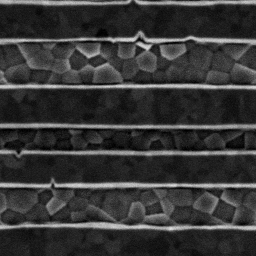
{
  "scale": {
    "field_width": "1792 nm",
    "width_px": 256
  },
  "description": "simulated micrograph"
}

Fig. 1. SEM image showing one or a few lines or trenches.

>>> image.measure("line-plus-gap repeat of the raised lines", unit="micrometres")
0.51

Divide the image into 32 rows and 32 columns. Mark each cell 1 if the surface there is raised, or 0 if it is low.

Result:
11111111111111111111111111111111
11111111111111111111111111111111
11111111111111111111111111111111
11111111111111111111111111111111
11111111111111111011111111111111
00000000000000000000000000000000
00000000000000000000000000000000
00000000000000000000000000000000
00000000000000000000000000000000
00000000000000000000000000000000
00000000000000000000000000000000
11111111111111111111111111111111
11111111111111111111111111111111
11111111111111111111111111111111
11111111111111111111111111111111
11111111111111111111111111111111
00000000000000000000000000000000
00000000000000000000000000000000
00000000000000000000000000000000
11111111111111111111111111111111
11111111111111111111111111111111
11111111111111111111111111111111
11111111111111111111111111111111
00000000000000000000000000000000
00000000000000000000000000000000
00000000000000000000000000000000
00000000000000000000000000000000
00000000000000000000000000000000
11111111111111111111101111000110
11111111111111111111111111111111
11111111111111111111111111111111
11111111111111111111111111111111